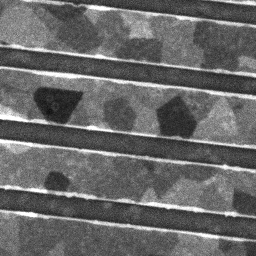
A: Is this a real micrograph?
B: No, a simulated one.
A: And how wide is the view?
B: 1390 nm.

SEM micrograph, one or a few lines or trenches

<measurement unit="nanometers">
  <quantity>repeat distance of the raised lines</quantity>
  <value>386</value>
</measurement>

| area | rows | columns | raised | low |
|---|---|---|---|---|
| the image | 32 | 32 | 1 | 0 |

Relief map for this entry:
11111111100000000000000000000001
11111111111111111000000000000000
11111111111111111111111111000000
11111111111111111111111111111111
11111111111111111111111111111111
11111111111111111111111111111111
00000001111111111111111111111111
00000000000000011111111111111111
10000000000000000000000011111111
11111111110000000000000000000001
11111111111111111110000000000000
11111111111111111111111111100000
11111111111111111111111111111111
11111111111111111111111111111111
11111111111111111111111111111111
00000011111111111111111111111111
00000000000000011111111111111111
00000000000000000000000111111111
11111111000000000000000000000001
11111111111111111000000000000000
11111111111111111111111110000000
11111111111111111111111111111111
11111111111111111111111111111111
01111111111111111111111111111111
00000000111111111111111111111111
00000000000000000111111111111111
11000000000000000000000000011111
11111111110000000000000000000000
11111111111111111110000000000000
11111111111111111111111111100000
11111111111111111111111111111111
11111111111111111111111111111111